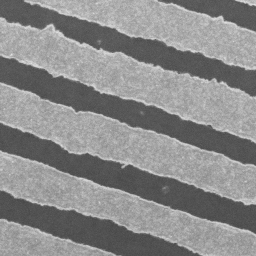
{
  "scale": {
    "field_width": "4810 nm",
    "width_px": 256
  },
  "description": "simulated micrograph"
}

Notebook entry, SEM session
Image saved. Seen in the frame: one or a few lines or trenches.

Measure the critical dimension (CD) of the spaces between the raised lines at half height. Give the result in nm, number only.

496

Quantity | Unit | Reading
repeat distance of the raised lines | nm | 1200